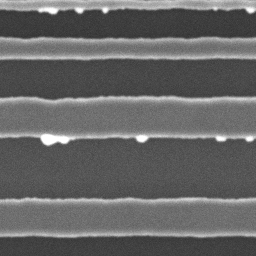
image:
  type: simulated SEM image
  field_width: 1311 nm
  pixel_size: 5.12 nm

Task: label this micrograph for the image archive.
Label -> lines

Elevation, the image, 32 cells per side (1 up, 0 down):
11111111111111111111111111111111
00000110000000000000000000000001
00000000000000000000000000000000
00000000000000000000000000000000
00000000000000000000000000000000
11111111111111111111111111111111
11111111111111111111111111111111
00000000000000000000000000000000
00000000000000000000000000000000
00000000000000000000000000000000
00000000000000000000000000000000
00000000000000000000000000000000
11111100111111111111111111111111
11111111111111111111111111111111
11111111111111111111111111111111
11111111111111111111111111111111
11111111111111111111111111111111
00000111100000000100000000010001
00000000000000000000000000000000
00000000000000000000000000000000
00000000000000000000000000000000
00000000000000000000000000000000
00000000000000000000000000000000
00000000000000000000000000000000
00000000000000000000000000000000
11111111111111111111111111111111
11111111111111111111111111111111
11111111111111111111111111111111
11111111111111111111111111111111
00000001110000000000000011000000
00000000000000000000000000000000
00000000000000000000000000000000